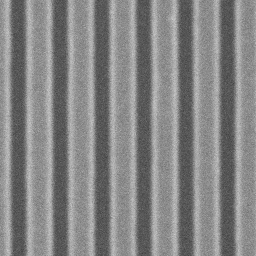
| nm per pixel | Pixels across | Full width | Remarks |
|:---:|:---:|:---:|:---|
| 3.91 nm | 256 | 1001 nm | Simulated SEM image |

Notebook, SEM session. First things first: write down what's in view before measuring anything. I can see parallel lines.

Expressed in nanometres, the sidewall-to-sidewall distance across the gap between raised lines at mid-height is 65.9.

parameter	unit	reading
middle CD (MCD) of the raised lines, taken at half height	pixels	24.7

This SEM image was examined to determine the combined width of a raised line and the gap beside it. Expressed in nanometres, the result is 163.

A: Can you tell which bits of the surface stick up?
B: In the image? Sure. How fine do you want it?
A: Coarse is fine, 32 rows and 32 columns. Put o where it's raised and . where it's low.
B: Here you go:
o..ooo...ooo..ooo..ooo..ooo...oo
o..ooo...ooo..ooo..ooo..ooo...oo
o..ooo...ooo..ooo..ooo..ooo...oo
o..ooo...ooo..ooo..ooo..ooo...oo
o...oo...ooo..ooo..ooo..ooo...oo
o..ooo...ooo..ooo..ooo..ooo...oo
o..ooo...ooo..ooo..ooo..ooo...oo
o..ooo...ooo..ooo..ooo..ooo...oo
o..ooo...ooo..ooo..ooo..ooo...oo
o..ooo...ooo..ooo..ooo..ooo...oo
o..ooo...ooo..ooo..ooo..ooo...oo
o..ooo...ooo..ooo..ooo..ooo...oo
o..ooo...ooo..ooo..ooo..ooo...oo
o..ooo...ooo..ooo..ooo..ooo...oo
o..ooo...ooo..ooo..ooo..ooo...oo
o..ooo...ooo..ooo..ooo..ooo...oo
o..ooo...ooo..ooo..ooo..ooo...oo
o..ooo...ooo..ooo..ooo..ooo...oo
o..ooo...ooo..ooo..ooo..ooo...oo
o..ooo...ooo..ooo..ooo..ooo...oo
o..ooo...ooo..ooo..ooo..ooo...oo
o..ooo...ooo..ooo..ooo..ooo...oo
o..ooo...ooo..ooo..ooo..ooo...oo
o..ooo...ooo..ooo..ooo..ooo...oo
o..ooo...ooo..ooo..ooo..ooo...oo
o..ooo...ooo..ooo..ooo..ooo...oo
o..ooo...ooo..ooo..ooo..ooo...oo
o..ooo...ooo..ooo..ooo..ooo...oo
o..ooo...ooo..ooo..ooo..ooo...oo
o..ooo...ooo..ooo..ooo..ooo...oo
o..ooo...ooo..ooo..ooo..ooo...oo
o..ooo...ooo..ooo..ooo..ooo...oo